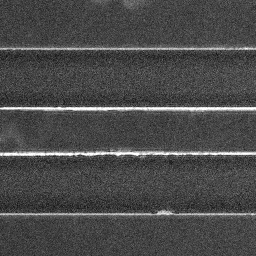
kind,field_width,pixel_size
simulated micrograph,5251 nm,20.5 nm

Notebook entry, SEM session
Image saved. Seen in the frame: lines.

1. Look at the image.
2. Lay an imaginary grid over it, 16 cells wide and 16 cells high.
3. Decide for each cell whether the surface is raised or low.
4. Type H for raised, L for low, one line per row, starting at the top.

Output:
HHHHHHHHHHHHHHHH
HHHHHHHHHHHHHHHH
HHHHHHHHHHHHHHHH
LLLLLLLLLLLLLLLL
LLLLLLLLLLLLLLLL
LLLLLLLLLLLLLLLL
LLLLLLLLLLLLLLLL
HHHHHHHHHHHHHHHH
HHHHHHHHHHHHHHHH
HHHHHHHHHHHHHHHH
LLLLLLLLLLLLLLLL
LLLLLLLLLLLLLLLL
LLLLLLLLLLLLLLLL
HHHHHHHHHHHHHHHH
HHHHHHHHHHHHHHHH
HHHHHHHHHHHHHHHH